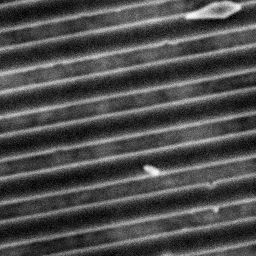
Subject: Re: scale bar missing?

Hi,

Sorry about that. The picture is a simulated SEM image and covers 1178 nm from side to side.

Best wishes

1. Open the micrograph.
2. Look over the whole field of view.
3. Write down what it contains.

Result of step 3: parallel lines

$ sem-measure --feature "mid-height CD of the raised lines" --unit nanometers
120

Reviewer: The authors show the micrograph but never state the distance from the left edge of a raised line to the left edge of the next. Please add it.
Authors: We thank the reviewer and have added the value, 0.196 µm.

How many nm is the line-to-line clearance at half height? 75.2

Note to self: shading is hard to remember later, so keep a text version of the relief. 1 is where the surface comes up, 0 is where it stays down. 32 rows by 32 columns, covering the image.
01111111111111111110000000011011
11111111111110000000000011111111
11111111000000000001111111111111
11100000000000111111111111111111
00000000111111111111111111000000
00011111111111111111000000000000
11111111111111100000000000011111
11111111110000000000011111111111
11110000000000001111111111111111
00000000000111111111111111110000
00000111111111111111111000000000
11111111111111111100000000000111
11111111111100000000000111111111
11111110000000000011111111111111
10000000000001111111111111111100
00000001111111111111111110000000
00111111111111111111000000000001
11111111111111000000000001111111
11111111100000000000111111111111
11110000000000011111111111111111
00000000011111111111111111100000
00001111111111111111110000000000
11111111111111110000000000001111
11111111111100000000000111111111
11111100000000000111111111111111
00000000000111111111111111111000
00000001111111111111111100000000
01111111111111111100000000000011
11111111111110000000000011111111
11111111000000000001111111111111
11000000000000111111111111111110
00000000111111111111111111000000